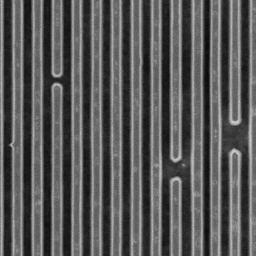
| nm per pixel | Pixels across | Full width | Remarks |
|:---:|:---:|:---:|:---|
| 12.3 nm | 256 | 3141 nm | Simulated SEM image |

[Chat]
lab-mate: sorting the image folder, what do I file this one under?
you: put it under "parallel lines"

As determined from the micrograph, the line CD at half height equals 0.127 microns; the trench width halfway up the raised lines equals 117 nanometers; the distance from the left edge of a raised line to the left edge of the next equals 0.242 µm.